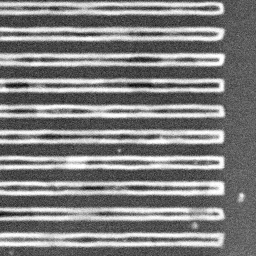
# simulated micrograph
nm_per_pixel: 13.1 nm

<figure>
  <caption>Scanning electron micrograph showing wiring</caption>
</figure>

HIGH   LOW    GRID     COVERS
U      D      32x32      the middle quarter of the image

DDDDDDDDDDDDDDDDDDDDDDDDDDDDDDDD
DDDDDDDDDDDDDDDDDDDDDDDDDDDDDDDD
DDDDDDDDDDDDDDDDDDDDDDDDDDDDDDDD
DDDDDDDDDDDDDDDDDDDDDDDDDDDDDDDD
UUUUUUUUUUUUUUUUUUUUUUUUUUUUUUUU
UUUUUUUUUUUUUUUUUUUUUUUUUUUUUUUU
UUUUDDDDDDUUDDUUUDDDDUUUUUUUDDDD
DDDDDDDDDDDDDDDDDDDDDDDDDDDDDDDD
DDDDDDDDDDDDDDDDDDDDDDDDDDDDDDDD
DDDDDDDDDDDDDDDDDDDDDDDDDDDDDDDD
DDDDDDDDDDDDDDDDDDDDDDDDDDDDDDDD
UUUUUUUUUUUUUUUUUUUUUUUUUUUUUUUU
UUUUUUUUUUUUUUUUUUUUUUUUUUUUUUUU
DDDDDDDDDDDDDDDDDDDDDDDDDDDDDDDD
DDDDDDDDDDDDDDDDDDDDDDDDDDDDDDDD
DDDDDDDDDDDDDDDDDDDDDDDDDDDDDDDD
DDDDDDDDDDDDDDDDDDDDDDDDDDDDDDDD
UUUUUUUUUUUUUUUUUUUUUUUUUUUUUUUU
UUUUUUUUUUUUUUUUUUUUUUUUUUUUUUUU
DDDDDDDDDDDDDDDDDDDDDDDDDDDDDDDD
DDDDDDDDDDDDDDDDDDDDDDDDDDDDDDDD
DDDDDDDDDDDDDDDDDDDDDDDDDDDDDDDD
DDDDDDDDDDDDDDDDDDDDDDDDDDDDDDDD
DDDDDDDDDDDDDDDDDDDDDDDDDDDDDDDD
UUUUUUUUUUUUUUUUUUUUUUUUUUUUUUUU
UUUUUUUUUUUUUUUUUUUUUUUUUUUUUUUU
DDDDDDDDDDDDDDDDDDDDDDDDDDDDDDDD
DDDDDDDDDDDDDDDDDDDDDDDDDDDDDDDD
DDDDDDDDDDDDDDDDDDDDDDDDDDDDDDDD
DDDDDDDDDDDDDDDDDDDDDDDDDDDDDDDD
UUUUUUUUUUUUUUUUUUUUUUUUUUUUUUUU
UUUUUUUUUUUUUUUUUUUUUUUUUUUUUUUU